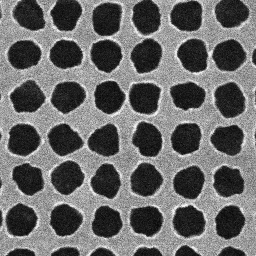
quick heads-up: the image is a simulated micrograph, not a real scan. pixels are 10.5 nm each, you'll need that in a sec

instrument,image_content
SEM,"a regular array of holes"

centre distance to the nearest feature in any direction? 414 nm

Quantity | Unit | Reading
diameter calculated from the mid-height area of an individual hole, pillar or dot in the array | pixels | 32.1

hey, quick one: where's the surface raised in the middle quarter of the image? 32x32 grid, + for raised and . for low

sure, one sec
...+++++......+++.......++++++..
+++++++++...++++++....++++++++..
++++++++++++++++++++++++++++++++
++++++++++++++++++++++++++++++++
...+++++++...++++++++++++++++++.
....++++......+++......++++.....
.....+++.......++.......++......
.....+++.......+........+++.....
.....+++.......+........+++.....
.....+++.......+.......++++.....
....++++......+++......+++++....
..+++++++.....++++.....+++++++.+
.++++++++++.+++++++..+++++++++++
++++++++++++++++++++++++++++++++
++++++++++++++++++++++++++++++++
.+++++++++...+++++.....+++++....
..++++++.....+++++......+++.....
....+++......+++++......+++.....
....++........+++........++.....
.....+........+++........++.....
.....+........++++.......++.....
...++++.......+++++.....+++.....
..++++++.....++++++....++++++..+
++++++++++++++++++++++++++++++++
...+++++++++++++++++.+++++++++++
....+++++...++++++.....+++++++++
....++++.....+++++.....++++++...
.....+++......+++.......++++....
.....++.......+++........++.....
.....++.......++.........++.....
....+++.......+++.......+++.....
...++++.......+++......+++++....